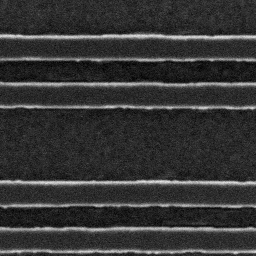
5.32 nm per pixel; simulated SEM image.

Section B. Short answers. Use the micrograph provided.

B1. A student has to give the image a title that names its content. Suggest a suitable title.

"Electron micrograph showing lines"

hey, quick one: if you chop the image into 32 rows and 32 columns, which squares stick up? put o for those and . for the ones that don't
................................
................................
................................
................................
oo.............oo.oo............
oooooooooooooooooooooooooooooooo
oooooooooooooooooooooooooooooooo
.........o..o....oooooooo....ooo
................................
................................
ooooo.oooooo....oooo.....ooo..oo
oooooooooooooooooooooooooooooooo
oooooooooooooooooooooooooooooooo
..................o..o..oo..oooo
................................
................................
................................
................................
................................
................................
................................
................................
................................
oooooooooooooooooooooooooooooooo
oooooooooooooooooooooooooooooooo
oooooooooooooooooooooooooooooooo
................................
................................
.....o..ooo....oooooo.o.........
oooooooooooooooooooooooooooooooo
oooooooooooooooooooooooooooooooo
ooo.o.oooooooooooooooooo.ooooooo